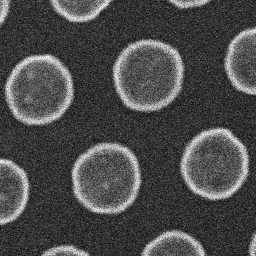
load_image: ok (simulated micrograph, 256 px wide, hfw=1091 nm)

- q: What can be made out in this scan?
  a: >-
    raised bodies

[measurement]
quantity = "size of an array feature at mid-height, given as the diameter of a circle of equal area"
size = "0.278 microns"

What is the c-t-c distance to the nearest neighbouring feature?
0.467 µm